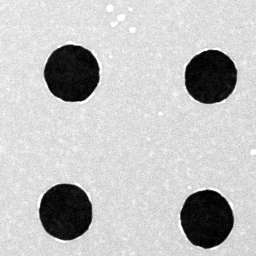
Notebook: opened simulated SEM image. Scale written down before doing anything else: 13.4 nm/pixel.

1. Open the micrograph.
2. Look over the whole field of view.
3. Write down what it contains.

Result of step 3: holes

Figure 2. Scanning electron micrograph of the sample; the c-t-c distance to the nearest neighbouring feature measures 1850 nm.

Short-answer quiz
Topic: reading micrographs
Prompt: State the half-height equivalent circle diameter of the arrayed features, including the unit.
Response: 746 nm